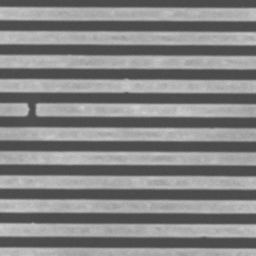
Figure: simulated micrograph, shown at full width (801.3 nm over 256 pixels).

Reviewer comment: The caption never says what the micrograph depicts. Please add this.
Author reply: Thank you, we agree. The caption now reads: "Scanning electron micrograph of parallel lines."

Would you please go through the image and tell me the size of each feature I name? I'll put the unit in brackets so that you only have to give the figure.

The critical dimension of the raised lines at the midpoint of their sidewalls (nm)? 40.3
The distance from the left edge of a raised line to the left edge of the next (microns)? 0.0752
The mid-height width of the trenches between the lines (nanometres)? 34.4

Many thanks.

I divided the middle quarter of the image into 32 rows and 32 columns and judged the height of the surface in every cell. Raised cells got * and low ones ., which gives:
********************************
................................
................................
................................
********************************
********************************
********************************
................................
................................
................................
********************************
********************************
********************************
................................
................................
................................
********************************
********************************
********************************
................................
................................
................................
********************************
********************************
********************************
................................
................................
................................
********************************
********************************
********************************
................................